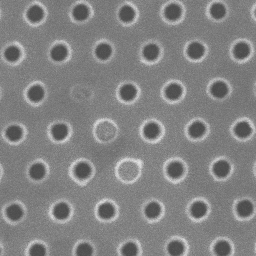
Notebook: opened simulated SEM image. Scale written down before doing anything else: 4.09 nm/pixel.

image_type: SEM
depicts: a regular array of holes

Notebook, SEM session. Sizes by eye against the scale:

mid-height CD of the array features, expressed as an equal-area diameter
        76.6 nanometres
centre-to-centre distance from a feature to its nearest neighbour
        184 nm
